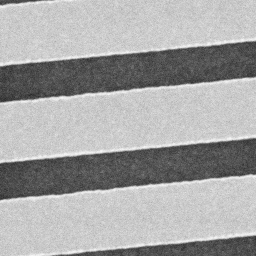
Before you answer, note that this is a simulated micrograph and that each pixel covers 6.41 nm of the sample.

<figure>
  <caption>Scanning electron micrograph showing lines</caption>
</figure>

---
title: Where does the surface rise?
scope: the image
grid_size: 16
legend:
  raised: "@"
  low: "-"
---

@@@@@@@@@@@@@@@@
@@@@@@@@@@@@@@@@
@@@@@@@@@@@@@@@@
@@@@@@@---------
----------------
---------@@@@@@@
@@@@@@@@@@@@@@@@
@@@@@@@@@@@@@@@@
@@@@@@@@@@@@@@@@
@@@@@@@---------
----------------
----------@@@@@@
@@@@@@@@@@@@@@@@
@@@@@@@@@@@@@@@@
@@@@@@@@@@@@@@@@
@@@@@@@@--------